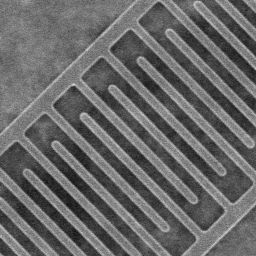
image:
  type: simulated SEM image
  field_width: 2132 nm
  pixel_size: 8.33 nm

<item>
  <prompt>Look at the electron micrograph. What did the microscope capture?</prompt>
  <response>groups of lines, slits or small figures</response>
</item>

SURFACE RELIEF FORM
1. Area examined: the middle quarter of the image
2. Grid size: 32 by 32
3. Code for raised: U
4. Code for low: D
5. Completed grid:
DUUUUUUDDDDDUUUDDDDUUUDDDDUUUDDD
UUUUUUDDDDDDDUUUDDDDUUUDDDDUUUDD
UUUUUDDDDDDDDDUUUDDDDUUUDDDDUUUD
UUUUDDDDDDDDDDDUUUDDDDUUUDDDDUUU
UUUUUDDDDDDDDDDDUUUDDDDUUUDDDDUU
UUDUUUDDDDDDUDDDDUUUDDDDUUUDDDDU
UDDDUUUDDDDUUUDDDDUUUDDDDUUUDDDD
DDDDDUUUDDDDUUUDDDDUUUDDDDUUUDDD
DDDDDDUUUDDDDUUUDDDDUUUDDDDUUUDD
DDDDDDDUUUDDDDUUUDDDDUUUDDDDUUUD
DDDDDDDDUUUDDDDUUUDDDDUUUDDDDUUU
DDDDDDDDDUUUDDDDUUUDDDDUUUDDDDUU
DDDDUUDDDDUUUDDDDUUUDDDDUUUDDDDU
DDDDUUUDDDDUUUDDDDUUUDDDDUUUDDDD
UDDDDUUUDDDDUUUDDDDUUUDDDDUUUDDD
UUDDDDUUUDDDDUUUDDDDUUUDDDDUUUDD
UUUDDDDUUUDDDDUUUDDDDUUUDDDDUUUD
DUUUDDDDUUUDDDDUUUDDDDUUUDDDDUUU
DDUUUDDDDUUUDDDDUUUDDDDUUUDDDDUU
DDDUUUDDDDUUUDDDDUUUDDDDUUUDDDDU
DDDDUUUDDDDUUUDDDDUUUDDDDUUUDDDD
UDDDDUUUDDDDUUUDDDDUUUDDDDUUUDDD
UUDDDDUUUDDDUUUDDDDDUUUDDDDUUUDD
UUUDDDDUUUDDDDUUUDDDDUUUDDDDUUUD
DUUUDDDDUUUDDDDUUUDDDDUUUDDDDUUU
DDUUUDDDDUUUDDDUUUDDDDUUUDDDDDUU
DDDUUUDDDDUUUDDDDUUUDDDDUUUDDDDU
DDDUUUDDDDDUUUDDDDUUUDDDUUUDDDDD
DDDDUUUDDDDDUUUDDDUUUDDDDUUUDDDD
UUDDDDUUUDDDDUUUDDDDUUUDDDDUUUDD
UUUDDDUUUDDDDUUUDDDDDUUUDDDUUUDD
UUUDDDDUUUDDDDUUUDDDDUUUDDDDUUUD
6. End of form